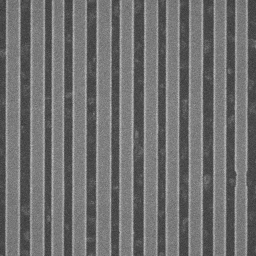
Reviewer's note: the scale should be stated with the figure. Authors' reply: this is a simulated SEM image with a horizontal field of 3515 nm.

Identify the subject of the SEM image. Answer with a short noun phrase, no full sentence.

parallel lines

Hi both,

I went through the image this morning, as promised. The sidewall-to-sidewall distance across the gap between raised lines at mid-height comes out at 146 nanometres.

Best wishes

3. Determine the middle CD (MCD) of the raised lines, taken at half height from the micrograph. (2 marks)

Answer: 172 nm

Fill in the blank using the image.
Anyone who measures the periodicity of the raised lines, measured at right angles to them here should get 314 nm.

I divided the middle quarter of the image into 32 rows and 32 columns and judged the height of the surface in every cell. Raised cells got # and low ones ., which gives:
..###...####..###...###...###...
..###...####..###...###...###...
..###...####..###...###...###...
..###...####..###...###...###...
..###...####..###...###...###...
..###...####..###...###...###...
..###...####..###...###...###...
..###...####..###...###...###...
..###...####..###...###...###...
..###...###...###...###...###...
..###...###...###...###...###...
..###...###...###...###...###...
..###...###...###...###...###...
..###...###...###...###...###...
..###...###...###...###...###...
..###...###...###...###...###..#
..###...###...###...###...###..#
..###...###...###...###...##....
..###...###...###...###...##....
..###...###...###...###...##....
..###...###...###...###...##....
..###...###...###...###...##....
..###...###...###...###...##....
..###...###...###...###...##....
..###...###...###...###...##....
..###...###...###...###...##....
..###...###...###...###...###...
..###...###...###...###...###...
..###...###...###...###...###...
..###...###...###...###...###...
..###...###...###...###...###...
..###...###...###...###...###...